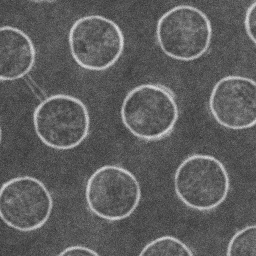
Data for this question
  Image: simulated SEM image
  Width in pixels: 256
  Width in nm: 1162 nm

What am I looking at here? raised bodies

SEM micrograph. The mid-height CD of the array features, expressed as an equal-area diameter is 235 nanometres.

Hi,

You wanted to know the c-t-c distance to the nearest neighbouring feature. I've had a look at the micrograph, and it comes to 392 nm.